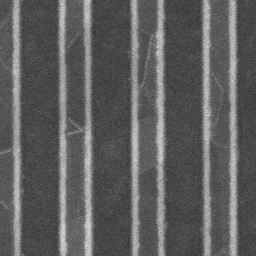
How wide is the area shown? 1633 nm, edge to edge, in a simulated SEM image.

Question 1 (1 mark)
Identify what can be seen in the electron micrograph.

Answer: one or a few lines or trenches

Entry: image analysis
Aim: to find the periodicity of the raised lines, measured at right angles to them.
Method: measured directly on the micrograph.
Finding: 461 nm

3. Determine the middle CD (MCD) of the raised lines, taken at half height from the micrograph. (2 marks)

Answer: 165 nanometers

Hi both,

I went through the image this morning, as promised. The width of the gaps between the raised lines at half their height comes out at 46.4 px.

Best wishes